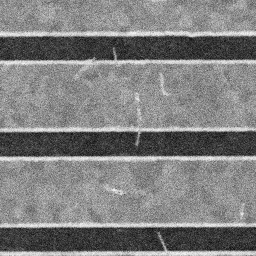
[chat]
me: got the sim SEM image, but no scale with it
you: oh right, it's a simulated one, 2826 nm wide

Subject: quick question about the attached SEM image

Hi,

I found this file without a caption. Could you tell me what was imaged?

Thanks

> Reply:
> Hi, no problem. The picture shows one or a few lines or trenches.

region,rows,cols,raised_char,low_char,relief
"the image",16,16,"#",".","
################
################
................
................
################
################
################
################
................
................
################
################
################
################
................
................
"